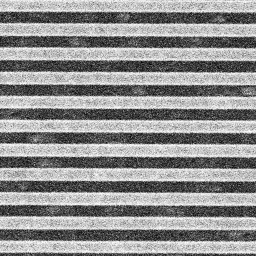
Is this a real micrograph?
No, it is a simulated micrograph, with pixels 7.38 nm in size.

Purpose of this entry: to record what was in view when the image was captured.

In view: parallel lines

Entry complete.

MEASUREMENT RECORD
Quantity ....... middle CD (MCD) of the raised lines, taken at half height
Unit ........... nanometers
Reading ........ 89.4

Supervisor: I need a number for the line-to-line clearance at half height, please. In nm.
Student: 89.4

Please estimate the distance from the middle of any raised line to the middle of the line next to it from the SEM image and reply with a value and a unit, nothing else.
178 nm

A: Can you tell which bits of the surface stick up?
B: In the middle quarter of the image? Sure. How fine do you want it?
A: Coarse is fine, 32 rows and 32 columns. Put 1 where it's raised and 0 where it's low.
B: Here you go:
00000000000000000000000000000000
00000000000000000000000000000000
11111111111111111111111111111111
11111111111111111111111111111111
11111111111111111111111111111111
00000000000000000000000000000000
00000000000000000000000000000000
00000000000000000000000000000000
11111111111111111111111111111111
11111111111111111111111111111111
11111111111111111111111111111111
00000000000000000000000000000000
00000000000000000000000000000000
00000000000000000000000000000000
11111111111111111111111111111111
11111111111111111111111111111111
11111111111111111111111111111111
00000000000000000000000000000000
00000000000000000000000000000000
00000000000000000000000000000000
11111111111111111111111111111111
11111111111111111111111111111111
11111111111111111111111111111111
00000000000000000000000000000000
00000000000000000000000000000000
00000000000000000000000000000000
11111111111111111111111111111111
11111111111111111111111111111111
11111111111111111111111111111111
00000000000000000000000000000000
00000000000000000000000000000000
00000000000000000000000000000000